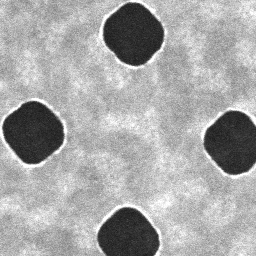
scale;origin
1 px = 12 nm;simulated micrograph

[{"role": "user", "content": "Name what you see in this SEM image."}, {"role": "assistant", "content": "holes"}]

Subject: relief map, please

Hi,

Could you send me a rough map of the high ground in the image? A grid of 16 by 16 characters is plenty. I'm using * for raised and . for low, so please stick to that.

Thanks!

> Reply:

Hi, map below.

*******..*******
*******...******
******....******
*******...******
****************
****************
*..*************
....**********..
....*********...
*..**********...
**************..
****************
****************
*******..*******
******....******
******....******